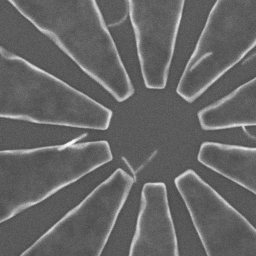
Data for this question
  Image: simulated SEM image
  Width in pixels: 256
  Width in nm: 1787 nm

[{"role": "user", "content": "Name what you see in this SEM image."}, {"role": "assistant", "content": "groups of lines, slits or small figures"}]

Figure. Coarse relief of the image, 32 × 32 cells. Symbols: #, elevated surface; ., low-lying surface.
..##########....#######....#####
...#########....#######...######
....#########...######....######
.....########....#####....######
.......#######...#####...#######
.......#######...#####...#######
........#######..#####..#######.
###......######...###...######..
####......#####...###..######...
######......####..###..####.....
########.....###..###.####.....#
##########....##......###....###
############................####
#############.............######
.#############...........#######
.......######............#######
................................
................................
.....#########...........#####..
##############...........#######
#############.............######
###########...#............#####
#########....###......###....###
#######.....####..###.####.....#
######.....#####..###..####.....
####......#####...###..#####....
##.......######...###...######..
#.......######...####...#######.
.......#######...#####..########
.....#########...#####...#######
....#########....#####...#######
...##########...######....######